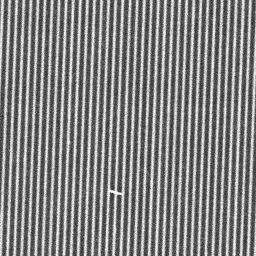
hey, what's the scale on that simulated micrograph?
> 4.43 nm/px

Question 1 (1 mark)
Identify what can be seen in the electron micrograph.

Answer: parallel lines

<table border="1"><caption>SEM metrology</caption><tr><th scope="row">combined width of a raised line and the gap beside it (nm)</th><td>31.4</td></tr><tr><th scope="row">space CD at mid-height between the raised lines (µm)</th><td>0.0227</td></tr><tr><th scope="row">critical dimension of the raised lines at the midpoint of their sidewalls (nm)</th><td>11.1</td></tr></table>